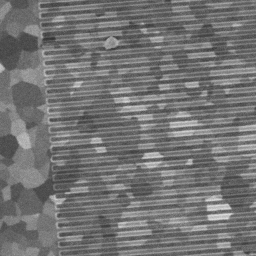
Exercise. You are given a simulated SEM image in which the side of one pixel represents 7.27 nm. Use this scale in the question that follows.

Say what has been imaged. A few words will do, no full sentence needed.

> parallel lines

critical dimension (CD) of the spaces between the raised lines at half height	38.9	nm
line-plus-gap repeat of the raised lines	0.0695	µm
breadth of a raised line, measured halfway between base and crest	0.0326	micrometres